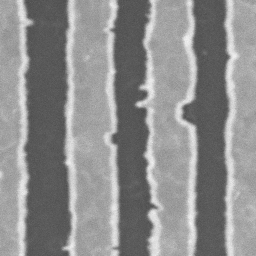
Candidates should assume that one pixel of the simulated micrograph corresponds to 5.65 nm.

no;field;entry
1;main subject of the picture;one or a few lines or trenches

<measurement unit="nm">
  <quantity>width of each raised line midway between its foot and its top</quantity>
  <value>237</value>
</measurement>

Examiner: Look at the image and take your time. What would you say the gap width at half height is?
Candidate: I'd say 224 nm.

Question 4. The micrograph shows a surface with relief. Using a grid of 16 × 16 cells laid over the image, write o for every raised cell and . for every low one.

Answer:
o...ooo...oo..oo
oo...oo..ooo..oo
o...ooo..ooo..oo
o...ooo..ooo..oo
o...ooo..ooo..oo
o...ooo..ooo..oo
o...ooo..ooo...o
oo..ooo..oo...oo
o...ooo..ooo..oo
o...ooo..ooo..oo
o...ooo..ooo..oo
o....oo..ooo..oo
o....oo...oo..oo
o....oo...oo..oo
o....oo...oo..oo
o...ooo...oo..oo